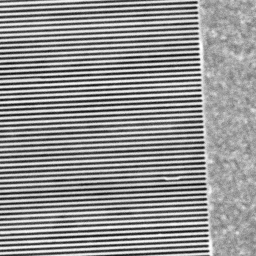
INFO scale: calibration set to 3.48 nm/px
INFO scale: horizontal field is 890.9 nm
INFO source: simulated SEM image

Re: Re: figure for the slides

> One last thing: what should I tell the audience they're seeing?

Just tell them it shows parallel lines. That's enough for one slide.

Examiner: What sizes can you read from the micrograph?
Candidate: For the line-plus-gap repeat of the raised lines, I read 5.2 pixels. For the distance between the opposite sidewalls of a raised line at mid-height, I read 8.7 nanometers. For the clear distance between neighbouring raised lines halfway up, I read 11.7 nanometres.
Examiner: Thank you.